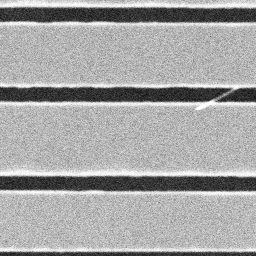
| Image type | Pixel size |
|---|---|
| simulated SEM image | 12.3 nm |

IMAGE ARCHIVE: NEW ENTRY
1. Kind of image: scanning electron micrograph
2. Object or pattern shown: lines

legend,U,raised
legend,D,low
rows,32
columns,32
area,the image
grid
UUUUUUUUUUUUUUUUUUUUUUUUUUUUUUUU
DDDDDDDDDDDDDDDDDDDDDDDDDDDDDDDD
DDDDDDDDDDDDDDDDDDDDDDDDDDDDDDDD
UUUUUUUUUUUUUUUUUUUUUUUUUUUUUUUU
UUUUUUUUUUUUUUUUUUUUUUUUUUUUUUUU
UUUUUUUUUUUUUUUUUUUUUUUUUUUUUUUU
UUUUUUUUUUUUUUUUUUUUUUUUUUUUUUUU
UUUUUUUUUUUUUUUUUUUUUUUUUUUUUUUU
UUUUUUUUUUUUUUUUUUUUUUUUUUUUUUUU
UUUUUUUUUUUUUUUUUUUUUUUUUUUUUUUU
UUUUUUUUUUUUUUUUUUUUUUUUUUUUUUUU
DDDDDDDDDDDDDDDDDDDDDDDDDDDDDDDD
DDDDDDDDDDDDDDDDDDDDDDDDDDDDDDDD
UUUUUUUUUUUUUUUUUUUUUUUUUUUUUUUU
UUUUUUUUUUUUUUUUUUUUUUUUUUUUUUUU
UUUUUUUUUUUUUUUUUUUUUUUUUUUUUUUU
UUUUUUUUUUUUUUUUUUUUUUUUUUUUUUUU
UUUUUUUUUUUUUUUUUUUUUUUUUUUUUUUU
UUUUUUUUUUUUUUUUUUUUUUUUUUUUUUUU
UUUUUUUUUUUUUUUUUUUUUUUUUUUUUUUU
UUUUUUUUUUUUUUUUUUUUUUUUUUUUUUUU
UUUUUUUUUUUUUUUUUUUUUUUUUUUUUUUU
DDDDDDDDDDDDDDDDDDDDDDDDDDDDDDDD
DDDDDDDDDDDDDDDDDDDDDDDDDDDDDDDD
UUUUUUUUUUUUUUUUUUUUUUUUUUUUUUUU
UUUUUUUUUUUUUUUUUUUUUUUUUUUUUUUU
UUUUUUUUUUUUUUUUUUUUUUUUUUUUUUUU
UUUUUUUUUUUUUUUUUUUUUUUUUUUUUUUU
UUUUUUUUUUUUUUUUUUUUUUUUUUUUUUUU
UUUUUUUUUUUUUUUUUUUUUUUUUUUUUUUU
UUUUUUUUUUUUUUUUUUUUUUUUUUUUUUUU
DDDDDDDDDDDDDDDDDDDDDDDDDDDDDDDD